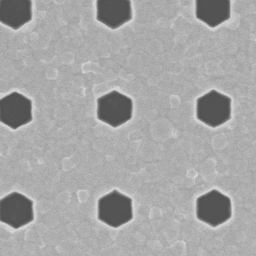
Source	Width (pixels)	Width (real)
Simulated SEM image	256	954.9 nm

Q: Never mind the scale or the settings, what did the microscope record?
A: holes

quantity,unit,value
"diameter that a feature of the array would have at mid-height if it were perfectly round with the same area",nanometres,127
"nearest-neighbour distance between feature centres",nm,369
